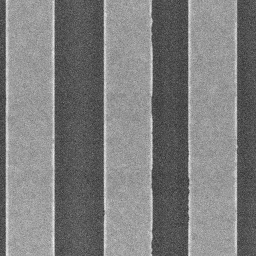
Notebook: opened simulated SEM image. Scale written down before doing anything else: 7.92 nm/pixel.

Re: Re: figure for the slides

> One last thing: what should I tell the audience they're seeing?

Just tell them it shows lines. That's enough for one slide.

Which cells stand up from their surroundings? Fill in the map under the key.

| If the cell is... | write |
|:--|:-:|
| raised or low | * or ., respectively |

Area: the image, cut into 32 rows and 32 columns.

.******......******.....******..
.******......******.....******..
.******......******.....******..
.******......******.....******..
.******......******.....******..
.******......******.....******..
.******......******.....******..
.******......******.....******..
.******......******.....******..
.******......******.....******..
.******......******.....******..
.******......******.....******..
.******......******.....******..
.******......******.....******..
.******......******.....******..
.******......******.....******..
.******......******.....******..
.******......******.....******..
.******......******.....******..
.******......******.....******..
.******......******.....******..
.******......******.....******..
.******......******.....******..
.******......******.....******..
.******......******.....******..
.******......******.....******..
.******......******.....******..
.******......******.....******..
.******......******.....******..
.******......******.....******..
.******......******.....******..
.******......******.....******..